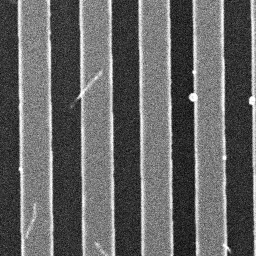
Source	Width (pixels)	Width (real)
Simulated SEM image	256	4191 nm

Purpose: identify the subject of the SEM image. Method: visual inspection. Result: lines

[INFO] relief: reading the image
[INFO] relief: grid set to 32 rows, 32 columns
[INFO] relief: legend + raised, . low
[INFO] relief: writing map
..++++....++++...++++...++++...+
..++++....++++...++++...++++....
..++++....++++...++++...++++....
..++++....++++....+++...++++....
..++++....++++....+++...++++....
..++++....++++....+++...++++....
..++++....++++....+++...++++....
..++++....++++....+++...++++....
..++++....++++....+++...++++....
..++++....++++....+++...++++....
..++++....++++....+++...++++....
...+++....++++....+++...++++....
...+++....++++....+++...++++...+
...+++....++++....+++...++++....
...+++....++++....+++...++++....
...+++....++++....+++...++++....
...+++....++++....+++...++++....
...+++....++++....+++...++++....
...+++....++++....+++...++++....
...+++....++++....+++...++++....
...+++....++++....+++...++++....
...+++....++++....+++...++++....
...+++....++++....+++...++++....
...+++....++++....+++...++++....
...+++....++++....+++...++++....
...+++....++++....+++...++++....
...+++....++++....+++...++++....
...++++...++++....++++..++++....
...++++...++++....++++...+++....
...++++...++++....++++...+++....
...++++...++++....++++...+++....
...++++...++++....++++...+++....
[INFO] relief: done